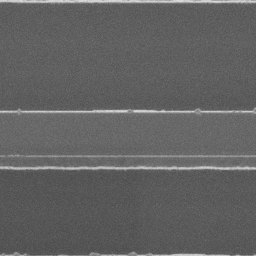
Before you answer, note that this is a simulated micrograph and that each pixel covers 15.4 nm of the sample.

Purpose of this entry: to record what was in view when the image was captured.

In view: lines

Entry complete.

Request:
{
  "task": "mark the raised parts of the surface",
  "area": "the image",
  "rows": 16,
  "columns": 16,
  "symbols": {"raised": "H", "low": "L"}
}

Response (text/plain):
LLLLLLLLLLLLLLLL
LLLLLLLLLLLLLLLL
LLLLLLLLLLLLLLLL
LLLLLLLLLLLLLLLL
LLLLLLLLLLLLLLLL
LLLLLLLLLLLLLLLL
LLLLLLLLLLLLLLLL
HHHHHHHHHHHHHHHH
HHHHHHHHHHHHHHHH
HHHHHHHHHHHHHHHH
LLLLLLLLLLLLLLLL
LLLLLLLLLLLLLLLL
LLLLLLLLLLLLLLLL
LLLLLLLLLLLLLLLL
LLLLLLLLLLLLLLLL
LLLLLLLLLLLLLLLL